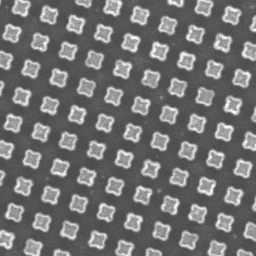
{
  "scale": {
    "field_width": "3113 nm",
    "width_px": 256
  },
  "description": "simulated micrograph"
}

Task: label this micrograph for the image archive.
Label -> a regular array of raised bodies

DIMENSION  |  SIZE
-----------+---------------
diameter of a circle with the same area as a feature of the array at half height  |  17.2 pixels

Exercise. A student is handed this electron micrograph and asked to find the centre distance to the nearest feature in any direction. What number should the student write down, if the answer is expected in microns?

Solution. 0.341